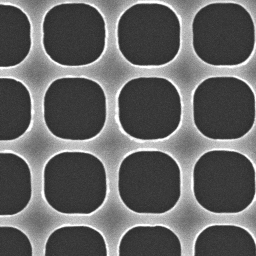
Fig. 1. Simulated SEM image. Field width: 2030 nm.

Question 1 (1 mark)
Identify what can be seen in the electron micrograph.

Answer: a regular array of holes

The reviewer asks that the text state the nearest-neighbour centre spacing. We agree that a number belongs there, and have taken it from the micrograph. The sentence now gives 590 nm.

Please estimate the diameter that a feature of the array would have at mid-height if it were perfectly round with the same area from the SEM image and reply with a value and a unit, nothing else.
0.521 um